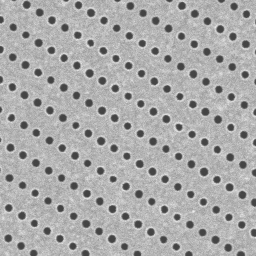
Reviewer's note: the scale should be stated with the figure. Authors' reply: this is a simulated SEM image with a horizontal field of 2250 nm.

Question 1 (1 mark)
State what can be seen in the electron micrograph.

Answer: a regular array of holes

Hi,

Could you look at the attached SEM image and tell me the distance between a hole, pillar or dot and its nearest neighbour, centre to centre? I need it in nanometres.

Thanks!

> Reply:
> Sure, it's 130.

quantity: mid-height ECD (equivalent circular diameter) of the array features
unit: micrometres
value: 0.0673